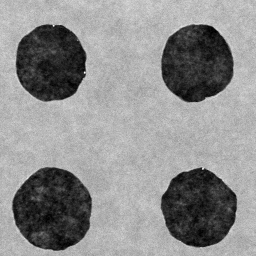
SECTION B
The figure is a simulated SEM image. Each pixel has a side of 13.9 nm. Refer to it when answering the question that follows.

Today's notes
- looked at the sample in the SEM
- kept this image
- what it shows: holes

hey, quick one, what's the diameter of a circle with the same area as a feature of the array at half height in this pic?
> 1050 nm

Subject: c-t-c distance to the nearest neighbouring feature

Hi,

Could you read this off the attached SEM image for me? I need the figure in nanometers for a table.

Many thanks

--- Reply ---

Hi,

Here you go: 2020